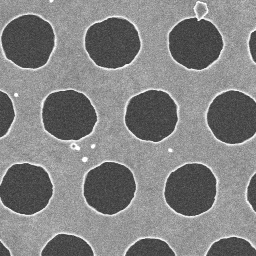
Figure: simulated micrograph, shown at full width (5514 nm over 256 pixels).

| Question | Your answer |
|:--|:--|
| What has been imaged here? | holes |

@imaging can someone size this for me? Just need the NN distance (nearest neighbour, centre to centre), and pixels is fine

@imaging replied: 82.7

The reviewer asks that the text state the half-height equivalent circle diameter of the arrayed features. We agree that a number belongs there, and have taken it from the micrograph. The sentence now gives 1.14 µm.